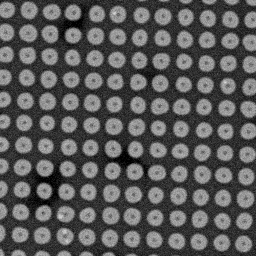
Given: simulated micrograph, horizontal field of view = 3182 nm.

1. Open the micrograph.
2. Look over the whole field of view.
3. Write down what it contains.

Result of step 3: an array of small figures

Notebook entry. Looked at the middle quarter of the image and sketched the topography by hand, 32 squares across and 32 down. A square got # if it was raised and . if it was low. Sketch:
............###..###...###..####
................................
.##...###.......................
####..###..###...###...##....##.
####.####..####..####.####..####
.##...###..####..###..####..####
.......................##....##.
................................
###...###...##...##.............
####.####..###...###..####..###.
###..####..###...###..####.####.
.#....##...###...###..####.####.
.......................#....##..
##..............................
###..####..###...###...##...##..
###..####..####.####..###...###.
###..###...###..####..###...###.
...........##....##...###...###.
................................
###..###...##....#..............
###..###..####..###...###...##..
###..###..####..####..####.####.
##...###...###..###...###..####.
.............................#..
##..............................
###..###...###..###...##........
###..###..####..####.####..####.
##...###..####..####.####..####.
...........##...###...###..###..
................................
##...##....##...................
##..####..####..###...##...###..